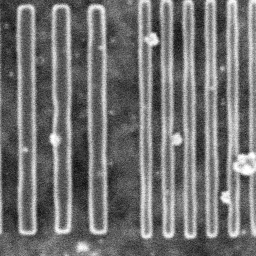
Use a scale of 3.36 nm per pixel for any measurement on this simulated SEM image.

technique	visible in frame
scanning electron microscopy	groups of lines, slits or small figures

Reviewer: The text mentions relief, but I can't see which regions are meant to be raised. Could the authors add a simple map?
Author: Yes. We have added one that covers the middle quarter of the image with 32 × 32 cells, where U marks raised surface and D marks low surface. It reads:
UDDDDDUUUUDDDDDDDDDUUUDDDUUDDDUU
UDDDDDUUUUDDDDDDDDDUUUDDDUUDDDUU
UDDDDDUUUUDDDDDDDDDUUUDDDUUDDDUU
UDDDDDUUUUDDDDDDDDDUUUDDDUUDDDUU
UDDDDDUUUUDDDDDDDDDUUUDDDUUDDDUU
UDDDDDUUUUDDDDDDDDDUUUDDDUUDDDUU
UDDDDDUUUUDDDDDDDDDUUUDDDUUDDDUU
UDDDDDUUUUDDDDDDDDDUUUDDDUUDDDUU
UDDDDDUUUUDDDDDDDDDUUUDDDUUDDDUU
UDDDDDUUUUDDDDDDDDDUUUDDDUUDDDUU
UDDDDDUUUUDDDDDDDDDUUUDDDUUDDDUU
UDDDDDUUUUDDDDDDDDDUUUDDDUUDDDUU
UDDDDDUUUUDDDDDDDDDUUUDDDUUDDDUU
UDDDDDUUUUDDDDDDDDDUUDDDDUUDDDUU
UDDDDDUUUUDDDDDDDDDUUUDDDUUDDDUU
UDDDDDUUUUDDDDDDDDDUUUDDDUUDDDUU
UDDDDDUUUUDDDDDDDDDUUUDDDUUDDDUU
UDDDDDUUUUDDDDDDDDDUUUDDDUUDDDUU
UDDDDDUUUUDDDDDDDDDUUUDDDUUUUDUU
UDDDDDUUUUDDDDDDDDDUUUDDDUUUUDUU
UDDDDDDUUUDDDDDDDDDUUUDDDUUDDDUU
UDDDDDDUUUDDDDDDDDDUUUDDDUUDDDUU
UDDDDDDUUUDDDDDDDDDUUUDDDUUDDDUU
UDDDDDDUUUDDDDDDDDDUUUDDDUUDDDUU
UDDDDDDUUUDDDDDDDDDUUUDDDUUDDDUU
UDDDDDDUUUDDDDDDDDDUUUDDDUUDDDUU
UDDDDDDUUUDDDDDDDDDUUUDDDUUDDDUU
UUDDDDDUUUDDDDDDDDDUUUDDDUUDDDUU
UUDDDDDUUUDDDDDDDDDDUUDDDUUDDDUU
UUDDDDDUUUDDDDDDDDDDUUDDDUUDDDUU
UUDDDDDUUUDDDDDDDDDDUUDDDUUDDDUU
UUDDDDDUUUDDDDDDDDDDUUDDDUUDDDUU